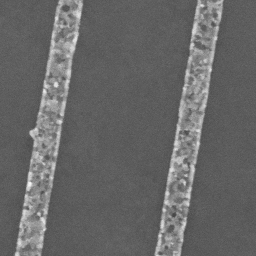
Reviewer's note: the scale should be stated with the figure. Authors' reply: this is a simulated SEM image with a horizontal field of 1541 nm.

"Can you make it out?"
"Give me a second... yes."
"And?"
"one or a few lines or trenches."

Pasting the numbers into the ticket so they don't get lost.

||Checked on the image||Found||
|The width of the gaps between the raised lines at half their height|700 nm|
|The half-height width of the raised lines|130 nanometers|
